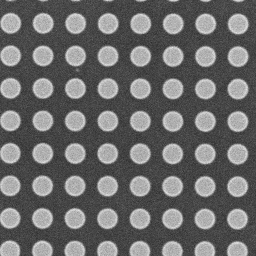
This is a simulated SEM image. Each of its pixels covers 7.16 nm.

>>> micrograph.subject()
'an array of small figures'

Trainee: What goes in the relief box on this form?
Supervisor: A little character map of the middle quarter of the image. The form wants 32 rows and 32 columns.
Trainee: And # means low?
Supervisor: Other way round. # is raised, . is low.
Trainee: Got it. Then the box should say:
................................
................................
................................
................................
.###.....####.....###....####...
#####....####....####....#####..
#####....####....####....#####..
.####....####....####....####...
..........##......##......##....
................................
................................
................................
.####....####....###......###...
#####....####....####....####...
#####....####....####....#####..
.####....####....####....####...
..##......##......##......##....
................................
................................
................................
.###.....####....###......###...
.####....####....####....####...
#####....####....####....#####..
.####....####....####....####...
.###......##......##......###...
................................
................................
................................
.###......##......##......##....
.####....####....####....####...
#####....####....####....#####..
.####....####....####....####...